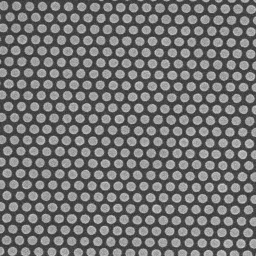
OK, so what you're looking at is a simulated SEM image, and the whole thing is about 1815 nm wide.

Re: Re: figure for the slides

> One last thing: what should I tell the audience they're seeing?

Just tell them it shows a regular array of raised bodies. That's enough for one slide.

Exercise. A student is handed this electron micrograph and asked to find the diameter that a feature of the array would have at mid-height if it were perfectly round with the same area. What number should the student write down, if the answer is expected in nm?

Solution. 63.5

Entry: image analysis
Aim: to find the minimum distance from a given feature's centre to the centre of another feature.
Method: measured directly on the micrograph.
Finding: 89.1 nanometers